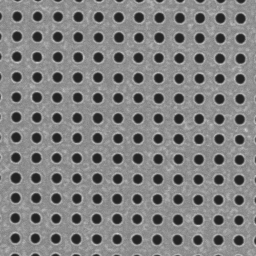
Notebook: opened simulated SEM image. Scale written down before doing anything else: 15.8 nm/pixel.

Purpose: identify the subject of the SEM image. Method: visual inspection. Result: a regular array of holes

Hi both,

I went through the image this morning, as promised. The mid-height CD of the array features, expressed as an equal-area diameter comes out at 151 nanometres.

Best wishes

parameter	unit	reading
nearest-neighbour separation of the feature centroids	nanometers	317